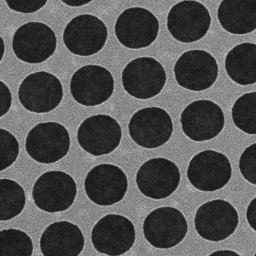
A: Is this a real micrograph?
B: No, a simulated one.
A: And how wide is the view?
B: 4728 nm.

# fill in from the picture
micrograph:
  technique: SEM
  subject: a regular array of holes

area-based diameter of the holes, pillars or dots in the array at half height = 0.798 um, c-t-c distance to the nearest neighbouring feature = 925 nanometers